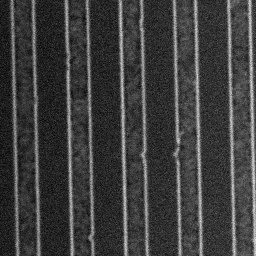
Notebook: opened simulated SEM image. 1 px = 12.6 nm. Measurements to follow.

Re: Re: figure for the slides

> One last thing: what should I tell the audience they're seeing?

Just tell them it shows parallel lines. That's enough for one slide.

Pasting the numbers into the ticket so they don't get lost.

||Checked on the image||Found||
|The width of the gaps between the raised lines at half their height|265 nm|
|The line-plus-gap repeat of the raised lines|680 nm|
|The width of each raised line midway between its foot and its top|421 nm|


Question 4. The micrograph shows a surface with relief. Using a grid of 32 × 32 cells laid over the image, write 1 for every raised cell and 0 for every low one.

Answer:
11001111000111100011110001111001
11001111000111100011110011111001
11001111000111100011110001111001
11001111000111100011110001111001
11001111000111100011110001111001
11001111000111100011110001111001
11001111000111100011110001111001
11001111000111100011110001111001
11001111100111100011110001111001
11001111000111100011110001111001
11001111000111100011110001111001
11001111000111100011110001111001
11001111100111100011110001111000
11001111100111100011110001111000
11001111100111100011110001111000
11001111100111100011110001111000
11000111100111100011110001111000
11000111100111100011110001111000
11000111100111100011110001111000
11000111100111100011110001111000
11000111100111110011110001111000
11000111100111110011110001111000
11000111100111110011110001111000
11000111100111110011110001111000
11000111100011110011110001111000
11000111100011110011110001111000
11000111100011110011110001111000
11000111100011110011110001111000
11000111100011110011110001111000
11000111100111110011110001111000
11000111100011110011110001111000
11000111100011110011110001111000